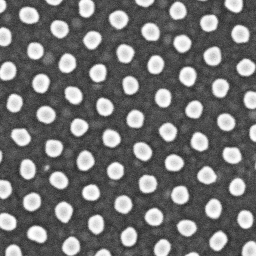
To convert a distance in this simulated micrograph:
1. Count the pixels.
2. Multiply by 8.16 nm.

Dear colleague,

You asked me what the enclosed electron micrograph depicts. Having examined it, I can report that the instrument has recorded a regular array of raised bodies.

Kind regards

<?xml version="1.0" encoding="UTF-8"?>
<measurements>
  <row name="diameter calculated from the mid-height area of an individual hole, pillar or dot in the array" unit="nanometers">130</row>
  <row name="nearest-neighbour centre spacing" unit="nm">264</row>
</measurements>